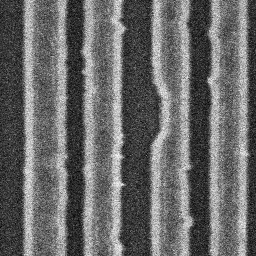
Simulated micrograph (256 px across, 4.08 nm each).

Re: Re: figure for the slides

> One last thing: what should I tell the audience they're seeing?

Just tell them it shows one or a few lines or trenches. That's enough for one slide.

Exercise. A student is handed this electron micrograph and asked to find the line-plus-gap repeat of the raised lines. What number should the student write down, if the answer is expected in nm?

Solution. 250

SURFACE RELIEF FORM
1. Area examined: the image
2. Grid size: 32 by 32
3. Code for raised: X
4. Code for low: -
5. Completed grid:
----XXXX---XXXX-----XXX----XXX--
----XXXX---XXXX-----XXX----XXX--
----XXXX---XXXX-----XXX----XXX--
----XXXX---XXXX-----XXX----XXX--
----XXXX---XXXX-----XXX----XXX--
----XXXX---XXXX-----XXX----XXX--
----XXXX---XXXX-----XXX----XXX--
----XXXX---XXXX-----XXX----XXX--
----XXXX---XXXX-----XXX----XXX--
----XXXX---XXXX-----XXX----XXX--
----XXXX---XXXX-----XXX----XXX--
----XXXX---XXXX-----XXX----XXX--
----XXXX---XXXX------XX----XXX--
----XXXX---XXXX------XX----XXX--
----XXXX---XXXX------XX----XXX--
----XXXX---XXXX------XX----XXX--
----XXXX---XXXX------XX----XXX--
----XXXX---XXXX-----XXX----XXX--
----XXXX---XXXX-----XXX----XXX--
----XXXX---XXXX-----XXX----XXX--
----XXXX---XXX------XXX----XXX--
----XXXX---XXX------XXX----XXX--
----XXXX---XXXX-----XXX----XXX--
----XXXX---XXXX-----XXX----XXX--
----XXXX---XXX------XXX----XXX--
----XXXX---XXX------XXX----XXX--
----XXXX---XXX------XXX----XXX--
----XXXX---XXX------XXX----XXX--
----XXXX---XXX-----XXXX----XXX--
----XXXX---XXX-----XXXX----XXX--
----XXXX---XXXX----XXXX----XXX--
----XXXX---XXXX-----XXX----XXX--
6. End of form